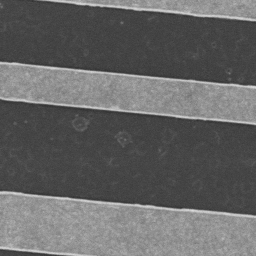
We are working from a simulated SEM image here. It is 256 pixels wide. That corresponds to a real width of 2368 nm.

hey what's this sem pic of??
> one or a few lines or trenches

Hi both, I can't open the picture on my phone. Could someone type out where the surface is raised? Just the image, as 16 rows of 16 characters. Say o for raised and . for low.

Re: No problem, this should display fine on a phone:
........oooooooo
................
................
................
oooooo..........
oooooooooooooooo
...ooooooooooooo
..............oo
................
................
................
................
ooooo...........
ooooooooooooooo.
oooooooooooooooo
oooooooooooooooo